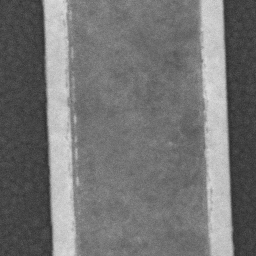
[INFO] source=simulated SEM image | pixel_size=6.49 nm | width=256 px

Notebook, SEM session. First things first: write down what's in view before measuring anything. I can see one or a few lines or trenches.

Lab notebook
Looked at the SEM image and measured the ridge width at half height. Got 1000 nm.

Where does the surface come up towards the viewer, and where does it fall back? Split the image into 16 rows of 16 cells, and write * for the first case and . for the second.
...**********...
....*********...
....*********...
....*********...
....*********...
....*********...
....*********...
....*********...
....*********...
....**********..
....**********..
....**********..
....**********..
....**********..
....**********..
....**********..